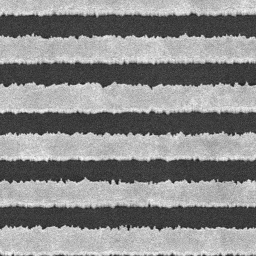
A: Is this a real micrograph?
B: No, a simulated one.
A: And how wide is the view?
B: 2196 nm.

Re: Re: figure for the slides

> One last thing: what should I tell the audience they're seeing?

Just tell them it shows lines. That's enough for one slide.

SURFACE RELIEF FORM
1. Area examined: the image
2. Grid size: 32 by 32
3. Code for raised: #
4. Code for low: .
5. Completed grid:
################################
################################
................................
................................
....#........#.........#....#...
################################
################################
################################
................................
................................
...#.......#..#.................
################################
################################
################################
................................
................................
................................
################################
################################
################################
................................
................................
..........#.....................
################################
################################
################################
................................
................................
###.#.####.....####...#....#....
################################
################################
################################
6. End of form